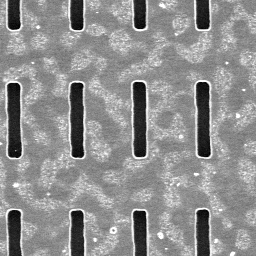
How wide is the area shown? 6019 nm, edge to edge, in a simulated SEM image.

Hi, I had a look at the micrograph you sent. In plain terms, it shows holes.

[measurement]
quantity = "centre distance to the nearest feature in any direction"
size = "1480 nanometers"